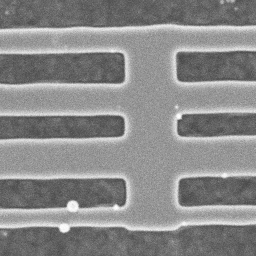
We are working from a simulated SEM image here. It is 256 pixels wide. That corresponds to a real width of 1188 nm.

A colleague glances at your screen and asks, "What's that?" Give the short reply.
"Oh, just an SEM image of groups of lines, slits or small figures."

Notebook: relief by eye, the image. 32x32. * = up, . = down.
................................
................................
................................
.........**....*****************
********************************
********************************
***********************.........
................******..........
................******..........
................******..........
.....**........*****************
********************************
********************************
********************************
...............********.........
................******..........
................******..........
********************************
********************************
********************************
********************************
********************************
...............********.........
................******..........
................******..........
.........*......******..........
********************************
********************************
.......**.......******..........
................................
................................
................................